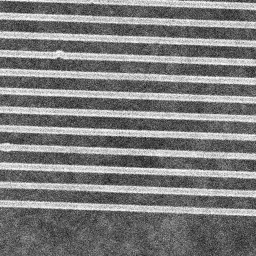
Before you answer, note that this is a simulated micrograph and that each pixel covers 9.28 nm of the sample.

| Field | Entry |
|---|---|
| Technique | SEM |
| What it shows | parallel lines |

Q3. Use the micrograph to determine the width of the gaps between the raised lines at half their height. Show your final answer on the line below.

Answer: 0.124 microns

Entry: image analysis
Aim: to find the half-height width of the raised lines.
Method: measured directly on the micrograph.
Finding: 49.8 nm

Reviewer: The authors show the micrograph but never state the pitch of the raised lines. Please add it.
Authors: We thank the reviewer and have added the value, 174 nanometres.